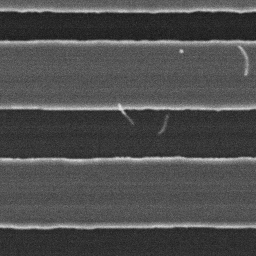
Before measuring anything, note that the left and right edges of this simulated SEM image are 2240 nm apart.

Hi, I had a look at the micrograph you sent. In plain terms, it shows lines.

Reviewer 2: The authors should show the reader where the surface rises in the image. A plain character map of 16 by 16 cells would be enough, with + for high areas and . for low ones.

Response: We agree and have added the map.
++++++++++++++++
................
................
++++++++++++++++
++++++++++++++++
++++++++++++++++
++++++++++++++++
................
................
................
++++++++++++++++
++++++++++++++++
++++++++++++++++
++++++++++++++++
................
................